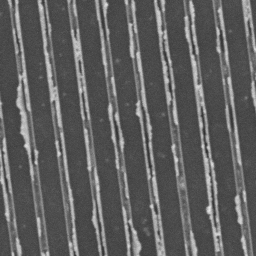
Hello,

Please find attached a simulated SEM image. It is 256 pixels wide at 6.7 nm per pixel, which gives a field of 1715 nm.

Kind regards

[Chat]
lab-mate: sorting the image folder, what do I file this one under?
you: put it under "parallel lines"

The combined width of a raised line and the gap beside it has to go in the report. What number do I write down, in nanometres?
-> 194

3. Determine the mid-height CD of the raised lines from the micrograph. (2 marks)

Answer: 52.3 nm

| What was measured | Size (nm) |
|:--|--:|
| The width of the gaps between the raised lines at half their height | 136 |